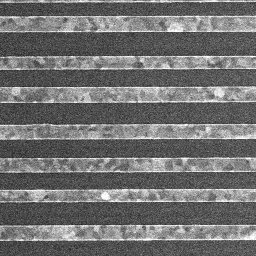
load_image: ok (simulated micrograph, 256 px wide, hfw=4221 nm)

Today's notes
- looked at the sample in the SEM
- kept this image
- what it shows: parallel lines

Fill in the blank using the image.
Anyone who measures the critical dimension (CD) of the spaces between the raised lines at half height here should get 324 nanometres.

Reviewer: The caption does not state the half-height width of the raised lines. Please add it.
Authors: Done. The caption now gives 229 nanometers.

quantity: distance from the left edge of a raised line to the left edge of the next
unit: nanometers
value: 574